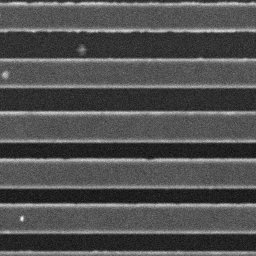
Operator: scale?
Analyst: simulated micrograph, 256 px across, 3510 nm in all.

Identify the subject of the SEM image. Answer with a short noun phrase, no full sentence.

lines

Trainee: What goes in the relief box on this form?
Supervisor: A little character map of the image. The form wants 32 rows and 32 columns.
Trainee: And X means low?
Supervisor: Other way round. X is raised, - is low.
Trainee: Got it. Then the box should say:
XXXXXXXXXXXXXXXXXXXXXXXXXXXXXXXX
XXXXXXXXXXXXXXXXXXXXXXXXXXXXXXXX
XXXXXXXXXXXXXXXXXXXXXXXXXXXXXXXX
XXXXXXXXXXXXXXXXXXXXXXXXXXXXXXXX
--------------------------------
--------------------------------
--------------------------------
XXXXXXXXXXXXXXXXXXXXXXXXXXXXXXXX
XXXXXXXXXXXXXXXXXXXXXXXXXXXXXXXX
XXXXXXXXXXXXXXXXXXXXXXXXXXXXXXXX
XXXXXXXXXXXXXXXXXXXXXXXXXXXXXXXX
--------------------------------
--------------------------------
--------------------------------
XXXXXXXXXXXXXXXXXXXXXXXXXXXXXXXX
XXXXXXXXXXXXXXXXXXXXXXXXXXXXXXXX
XXXXXXXXXXXXXXXXXXXXXXXXXXXXXXXX
XXXXXXXXXXXXXXXXXXXXXXXXXXXXXXXX
--------------------------------
--------------------------------
XXXXXXXXXXXXXXXXXXXXXXXXXXXXXXXX
XXXXXXXXXXXXXXXXXXXXXXXXXXXXXXXX
XXXXXXXXXXXXXXXXXXXXXXXXXXXXXXXX
--------------------------------
--------------------------------
--------------------------------
XXXXXXXXXXXXXXXXXXXXXXXXXXXXXXXX
XXXXXXXXXXXXXXXXXXXXXXXXXXXXXXXX
XXXXXXXXXXXXXXXXXXXXXXXXXXXXXXXX
--------------------------------
--------------------------------
---X-------XXX------------------